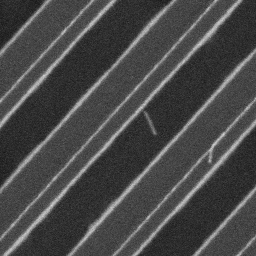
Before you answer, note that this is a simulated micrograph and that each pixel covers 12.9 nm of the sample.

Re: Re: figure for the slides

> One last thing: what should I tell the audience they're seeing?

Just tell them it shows lines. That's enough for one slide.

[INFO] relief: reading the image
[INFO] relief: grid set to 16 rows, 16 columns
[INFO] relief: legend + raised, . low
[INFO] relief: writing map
...++++...+++++.
..++++....++++..
.++++....++++...
++++....++++....
+++....++++....+
++....++++....++
+....++++....+++
....++++....++++
...++++....++++.
..++++....++++..
.++++....++++...
++++....++++....
++++....++++...+
+++....++++...++
++....++++....++
+....++++....+++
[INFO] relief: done